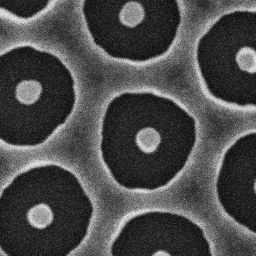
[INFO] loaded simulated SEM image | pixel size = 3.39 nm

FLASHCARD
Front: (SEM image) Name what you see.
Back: ring-shaped grooves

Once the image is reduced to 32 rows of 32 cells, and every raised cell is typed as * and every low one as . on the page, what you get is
......****......*.....**********
*....*****.....***.....******...
***********....***.....****.....
***********...........****......
***********...........***.......
************..........***.......
*.....*******........****.....**
........********...******.....**
........*****************.....**
.........****************.......
..***....****************.......
..***....*******...*******......
..**.....*****........*****.....
.........****..........*********
.........****...........********
........*****...........********
.......******.....**....********
......*******....***....******..
*************.....*.....*****...
*************...........****....
******.******..........****.....
***......*****.........****.....
**........****.......******.....
*.........******....*******.....
...........****************.....
............****************....
....**......******...*******....
....**.....*****........*****...
...........****..........******.
...........***............******
..........****............******
*........*****......*.....******